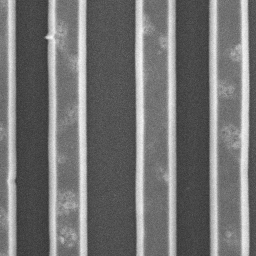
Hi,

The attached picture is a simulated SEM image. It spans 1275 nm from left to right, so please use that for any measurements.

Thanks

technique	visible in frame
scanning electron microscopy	one or a few lines or trenches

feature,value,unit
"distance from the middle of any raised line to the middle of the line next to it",402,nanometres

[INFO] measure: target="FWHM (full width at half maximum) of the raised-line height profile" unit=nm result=170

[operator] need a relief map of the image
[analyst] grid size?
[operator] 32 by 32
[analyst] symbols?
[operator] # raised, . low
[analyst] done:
##....####.......#####....#####.
##....####.......#####....#####.
##....####.......#####....#####.
##....####.......#####....#####.
##....####.......#####.....####.
##....####.......#####.....####.
##....####.......#####.....####.
##....####.......#####.....####.
##....####.......#####.....####.
##....####.......#####.....####.
##....####.......#####.....####.
##....####.......#####.....####.
##....####.......#####.....####.
##....####.......#####.....####.
##....####.......#####.....####.
##....####.......#####.....####.
##....####.......#####.....####.
##....####.......#####.....####.
##....####.......#####.....####.
##....####.......#####.....####.
##....#####......#####.....####.
##.....####......#####.....####.
##.....####......#####.....####.
##.....####......#####.....####.
##.....####......#####.....####.
##....#####......#####.....####.
##....#####......#####.....####.
##....#####......#####.....####.
##....#####......#####.....####.
##.....####......#####.....####.
##.....####......#####.....####.
##.....####......#####.....####.